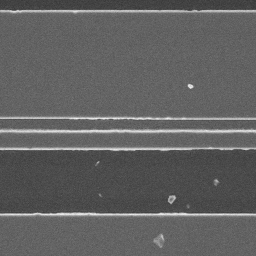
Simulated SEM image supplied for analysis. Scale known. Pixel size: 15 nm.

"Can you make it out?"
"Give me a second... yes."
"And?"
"lines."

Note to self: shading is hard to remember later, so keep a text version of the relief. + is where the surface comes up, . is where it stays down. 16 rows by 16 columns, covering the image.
................
++++++++++++++++
++++++++++++++++
++++++++++++++++
++++++++++++++++
++++++++++++++++
++++++++++++++++
++++++++++++++++
++++++++++++++++
................
................
................
................
++++++++++++++++
++++++++++++++++
++++++++++++++++